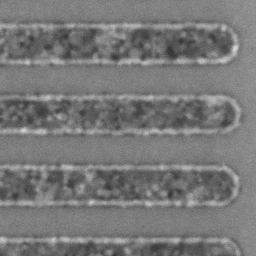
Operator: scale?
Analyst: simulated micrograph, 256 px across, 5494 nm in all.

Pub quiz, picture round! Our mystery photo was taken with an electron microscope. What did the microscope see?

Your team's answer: one or a few lines or trenches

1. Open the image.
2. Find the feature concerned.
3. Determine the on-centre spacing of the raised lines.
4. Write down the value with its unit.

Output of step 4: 1520 nanometres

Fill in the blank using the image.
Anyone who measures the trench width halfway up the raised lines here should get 770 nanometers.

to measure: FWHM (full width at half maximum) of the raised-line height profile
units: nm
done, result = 770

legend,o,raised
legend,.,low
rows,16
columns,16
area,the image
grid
................
................
ooooooooooooooo.
oooooooooooooo..
................
................
ooooooooooooooo.
ooooooooooooooo.
................
................
...oo..o.oo.....
ooooooooooooooo.
oooooooooooooo..
................
................
ooooooooooooooo.